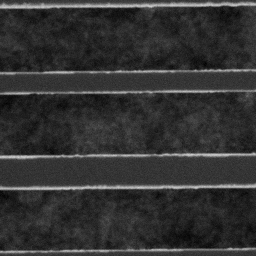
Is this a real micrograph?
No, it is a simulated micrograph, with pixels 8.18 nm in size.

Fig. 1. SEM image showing lines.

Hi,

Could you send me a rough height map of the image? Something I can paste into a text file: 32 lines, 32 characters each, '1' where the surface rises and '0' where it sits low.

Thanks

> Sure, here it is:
11111111111111111111111111111111
00000000000000000000000000000000
00000000000000000000000000000000
00000000000000000000000000000000
00000000000000000000000000000000
00000000000000000000000000000000
00000000000000000000000000000000
00000000000000000000000000000000
00000000000000000000000000000000
11111111111111111111111111111111
11111111111111111111111111111111
11111111111111111110000000000000
00000000000000000000000000000000
00000000000000000000000000000000
00000000000000000000000000000000
00000000000000000000000000000000
00000000000000000000000000000000
00000000000000000000000000000000
00000000000000000000000000000000
00000000000111111111111111111111
11111111111111111111111111111111
11111111111111111111111111111111
11111111111111111111111111111111
11111111111111111111111010000000
00000000000000000000000000000000
00000000000000000000000000000000
00000000000000000000000000000000
00000000000000000000000000000000
00000000000000000000000000000000
00000000000000000000000000000000
00000000000000000000000000000000
11111111111111111111111111111111